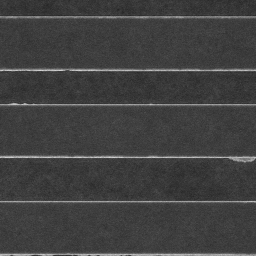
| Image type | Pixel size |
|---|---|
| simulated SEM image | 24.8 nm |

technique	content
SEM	lines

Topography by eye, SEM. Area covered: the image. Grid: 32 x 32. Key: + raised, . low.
................................
................................
++++++++++++++++++++++++++++++++
++++++++++++++++++++++++++++++++
++++++++++++++++++++++++++++++++
++++++++++++++++++++++++++++++++
++++++++++++++++++++++++++++++++
++++++++++++++++++++++++++++++++
++++++++++++++++++++++++++++++++
................................
................................
................................
................................
++++++++++++++++++++++++++++++++
++++++++++++++++++++++++++++++++
++++++++++++++++++++++++++++++++
++++++++++++++++++++++++++++++++
++++++++++++++++++++++++++++++++
++++++++++++++++++++++++++++++++
++++++++++++++++++++++++++++++++
................................
................................
................................
................................
................................
++++++++++++++++++++++++++++++++
++++++++++++++++++++++++++++++++
++++++++++++++++++++++++++++++++
++++++++++++++++++++++++++++++++
++++++++++++++++++++++++++++++++
++++++++++++++++++++++++++++++++
++++++++++++++++++++++++++++++++